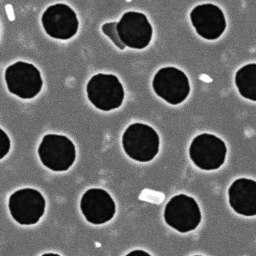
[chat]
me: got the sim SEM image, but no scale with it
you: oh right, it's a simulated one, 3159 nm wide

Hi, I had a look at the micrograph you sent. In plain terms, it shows a regular array of holes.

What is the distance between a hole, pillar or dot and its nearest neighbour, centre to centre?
820 nm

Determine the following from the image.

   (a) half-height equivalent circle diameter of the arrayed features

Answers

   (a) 457 nm